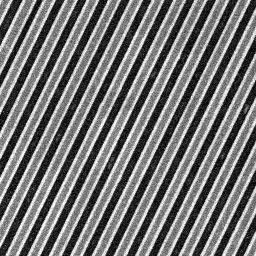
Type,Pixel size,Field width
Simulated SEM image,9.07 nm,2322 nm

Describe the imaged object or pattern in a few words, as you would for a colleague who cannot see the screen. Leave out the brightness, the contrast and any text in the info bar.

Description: parallel lines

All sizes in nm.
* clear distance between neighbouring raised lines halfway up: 86.6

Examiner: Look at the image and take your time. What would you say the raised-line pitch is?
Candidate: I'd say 176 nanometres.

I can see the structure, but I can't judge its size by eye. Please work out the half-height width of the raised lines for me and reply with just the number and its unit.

9.55 px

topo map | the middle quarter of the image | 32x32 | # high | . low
#..###...##...###...##...##...##
...##...###...##...###..###...##
..###...##...###...##...##...###
..##...###...##...###..###...##.
.###...###..###...##...##...###.
.##...###...##...###..###...###.
###...###..###...##...###..###..
##...###...##...###..###...###..
##...###..###...##...###...##...
#....##...##...###...##...###..#
#...###..###...##...###...##...#
...###...##...###...##...###..##
...###..###...##...###...##...##
...##...##...###...##...###..###
..###..###...##...###...##...###
..##...##...###...##...###...##.
.###..###...##...###...##...###.
.##...###..###...##...###...##..
###..###...##...###...##...###..
##...###..###...##...###...##...
##..###...##...###...##...###..#
#...###..###...##...###...##...#
#...##...##...###...##...###..##
...###..###...##...###...##...##
...##...##...###...##...###..###
..###..###...##...###...##...###
..##...##...###...##...###...##.
.###..###...##...###...##...###.
.##...##...###...##...###...##..
###..###...##...###...##...###..
##...###..###...##...###...##...
##..###...##...###...##...###...